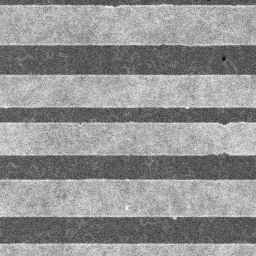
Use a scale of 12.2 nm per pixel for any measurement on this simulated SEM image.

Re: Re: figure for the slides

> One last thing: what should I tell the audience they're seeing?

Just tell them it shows parallel lines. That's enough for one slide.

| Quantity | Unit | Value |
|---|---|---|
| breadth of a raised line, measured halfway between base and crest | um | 0.419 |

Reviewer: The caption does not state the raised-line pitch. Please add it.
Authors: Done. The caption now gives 704 nanometres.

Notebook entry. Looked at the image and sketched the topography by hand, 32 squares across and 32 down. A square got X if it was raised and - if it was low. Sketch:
--------------------------------
XXXXXXXXXXXXXXXXXXXXXXXXXXXXXXXX
XXXXXXXXXXXXXXXXXXXXXXXXXXXXXXXX
XXXXXXXXXXXXXXXXXXXXXXXXXXXXXXXX
XXXXXXXXXXXXXXXXXXXXXXXXXXXXXXXX
XXXXXXXXXXXXX-XXXXXXXXXXXXXXXXXX
--------------------------------
--------------------------------
--------------------------------
XXXXXXXXXXXXXXXXXXXXXXXXXXXXXXXX
XXXXXXXXXXXXXXXXXXXXXXXXXXXXXXXX
XXXXXXXXXXXXXXXXXXXXXXXXXXXXXXXX
XXXXXXXXXXXXXXXXXXXXXXXXXXXXXXXX
--------------------------------
--------------------------------
XXXXXXXXXXXXXXXXXXXXXXXXXXX--XXX
XXXXXXXXXXXXXXXXXXXXXXXXXXXXXXXX
XXXXXXXXXXXXXXXXXXXXXXXXXXXXXXXX
XXXXXXXXXXXXXXXXXXXXXXXXXXXXXXXX
--------------------------------
--------------------------------
--------------------------------
-----------XXX-X----------------
XXXXXXXXXXXXXXXXXXXXXXXXXXXXXXXX
XXXXXXXXXXXXXXXXXXXXXXXXXXXXXXXX
XXXXXXXXXXXXXXXXXXXXXXXXXXXXXXXX
XXXXXXXXXXXXXXXXXXXXXXXXXXXXXXXX
--------------------------------
--------------------------------
--------------------------------
--------------------------------
XXXXXXXXXXXXXXXXXXXXXXXXXXXXXXXX